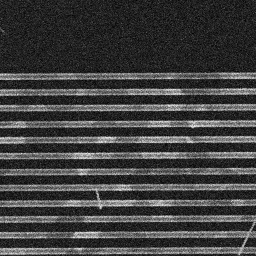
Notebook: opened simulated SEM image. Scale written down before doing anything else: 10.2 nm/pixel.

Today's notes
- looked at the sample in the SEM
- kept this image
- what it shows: parallel lines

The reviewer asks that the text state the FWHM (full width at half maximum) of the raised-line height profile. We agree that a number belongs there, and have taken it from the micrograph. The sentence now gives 56.1 nm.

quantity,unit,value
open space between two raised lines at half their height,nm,112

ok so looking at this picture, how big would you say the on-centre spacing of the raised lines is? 162 nanometers